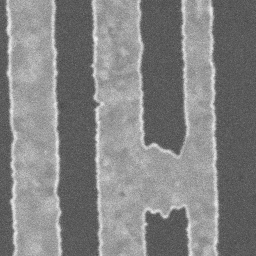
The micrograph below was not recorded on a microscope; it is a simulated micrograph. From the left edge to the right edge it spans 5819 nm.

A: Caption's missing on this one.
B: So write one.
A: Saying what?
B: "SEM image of one or a few lines or trenches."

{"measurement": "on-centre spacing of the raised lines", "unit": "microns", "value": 1.89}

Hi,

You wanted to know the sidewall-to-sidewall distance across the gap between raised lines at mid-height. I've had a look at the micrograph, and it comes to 0.954 µm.